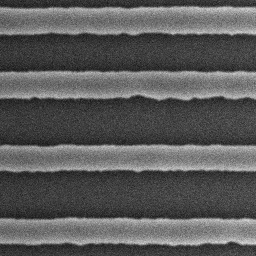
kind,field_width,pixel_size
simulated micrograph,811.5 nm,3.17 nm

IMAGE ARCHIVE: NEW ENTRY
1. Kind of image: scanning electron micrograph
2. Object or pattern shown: lines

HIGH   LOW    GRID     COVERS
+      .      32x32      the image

................................
++++++++++++++++++++++++++++++++
++++++++++++++++++++++++++++++++
++++++++++++++++++++++++++++++++
................................
................................
................................
................................
................................
++++++++++++++++++++++++++++++++
++++++++++++++++++++++++++++++++
++++++++++++++++++++++++++++++++
................................
................................
................................
................................
................................
................................
++++++++++++++++++++++++++++++++
++++++++++++++++++++++++++++++++
++++++++++++++++++++++++++++++++
................................
................................
................................
................................
................................
................................
+++...+++++++++++++++...++++++++
++++++++++++++++++++++++++++++++
++++++++++++++++++++++++++++++++
...++....++.....+++.+++++.....++
................................